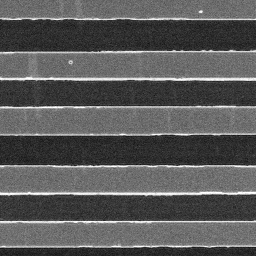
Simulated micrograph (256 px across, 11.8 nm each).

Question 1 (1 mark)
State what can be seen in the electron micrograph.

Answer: lines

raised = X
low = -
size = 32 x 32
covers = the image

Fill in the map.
XXXXXXXXXXXXXXXXXXXXXXXXXXXXXXXX
XXXXXXXXXXXXXXXXXXXXXXXXXXXXXXXX
--------------------------------
--------------------------------
--------------------------------
--------------------------------
----------------XXXXXXXXXXXXXXXX
XXXXXXXXXXXXXXXXXXXXXXXXXXXXXXXX
XXXXXXXXXXXXXXXXXXXXXXXXXXXXXXXX
XXXXXXXXXXXXXXXXXXXXXXXXXXXXXXXX
--------------------------------
--------------------------------
--------------------------------
XXXXXXXXXXXXXXXXXXXXXXXXXXXXXXXX
XXXXXXXXXXXXXXXXXXXXXXXXXXXXXXXX
XXXXXXXXXXXXXXXXXXXXXXXXXXXXXXXX
XXXXXXXXXXXXXXXXXXXXXXXXXXXXXXXX
--------------------------------
--------------------------------
--------------------------------
--------------------------------
XXXXXXXXXXXXXXXXXXXXXXXXXXXXXXXX
XXXXXXXXXXXXXXXXXXXXXXXXXXXXXXXX
XXXXXXXXXXXXXXXXXXXXXXXXXXXXXXXX
--------------------------------
--------------------------------
--------------------------------
--------------------------------
XXXXXXXXXXXXXXXXXXXXXXXXXXXXXXXX
XXXXXXXXXXXXXXXXXXXXXXXXXXXXXXXX
XXXXXXXXXXXXXXXXXXXXXXXXXXXXXXXX
--------------------------------